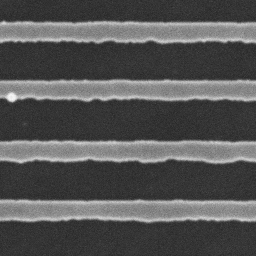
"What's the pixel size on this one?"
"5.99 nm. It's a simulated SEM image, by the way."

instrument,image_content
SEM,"lines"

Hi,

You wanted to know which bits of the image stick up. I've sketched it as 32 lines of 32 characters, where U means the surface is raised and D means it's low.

DDDDDDDDDDDDDDDDDDDDDDDDDDDDDDDD
DDDDDDDDDDDDDDDDDDDDDDDDDDDDDDDD
DDDDDDDDDDDDDDDDDDDDDDDDDDDDDDDD
UUUUUUUUUUUUUUUUUUUUUUUUUUUUUUUU
UUUUUUUUUUUUUUUUUUUUUUUUUUUUUUUU
DDDDDDDDDDDDDDDDDDDDDDDDDDDDDDDD
DDDDDDDDDDDDDDDDDDDDDDDDDDDDDDDD
DDDDDDDDDDDDDDDDDDDDDDDDDDDDDDDD
DDDDDDDDDDDDDDDDDDDDDDDDDDDDDDDD
DDDDDDDDDDDDDDDDDDDDDDDDDDDDDDDD
UUUUUUUUUUUUUUUUUUUUUUUUUUUUUUUU
UUUUUUUUUUUUUUUUUUUUUUUUUUUUUUUU
DUDDDDDDDDUDDDDDDDDDDDDDDDDDDDUU
DDDDDDDDDDDDDDDDDDDDDDDDDDDDDDDD
DDDDDDDDDDDDDDDDDDDDDDDDDDDDDDDD
DDDDDDDDDDDDDDDDDDDDDDDDDDDDDDDD
DDDDDDDDDDDDDDDDDDDDDDDDDDDDDDDD
DDDDDDDDDDDDDDDDDDDDDDDDDDDDDDDD
UUUUUUUUUUUUUUUUUUUUUUUUUUUUUUUU
UUUUUUUUUUUUUUUUUUUUUUUUUUUUUUUU
DDDDDDDDDDDDDDDDDDDDDDDDDDDDDDDD
DDDDDDDDDDDDDDDDDDDDDDDDDDDDDDDD
DDDDDDDDDDDDDDDDDDDDDDDDDDDDDDDD
DDDDDDDDDDDDDDDDDDDDDDDDDDDDDDDD
DDDDDDDDDDDDDDDDDDDDDDDDDDDDDDDD
UUUUUUUUUUUUUUUUUUUUUUUUUUUUUUUU
UUUUUUUUUUUUUUUUUUUUUUUUUUUUUUUU
DDUUUDDDDDDDDDDDDUUUUUDDDDDDDDUU
DDDDDDDDDDDDDDDDDDDDDDDDDDDDDDDD
DDDDDDDDDDDDDDDDDDDDDDDDDDDDDDDD
DDDDDDDDDDDDDDDDDDDDDDDDDDDDDDDD
DDDDDDDDDDDDDDDDDDDDDDDDDDDDDDDD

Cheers